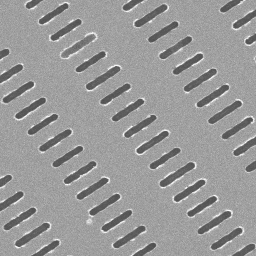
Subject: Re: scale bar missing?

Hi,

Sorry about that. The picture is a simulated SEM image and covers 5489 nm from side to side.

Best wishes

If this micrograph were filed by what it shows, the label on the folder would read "a regular array of holes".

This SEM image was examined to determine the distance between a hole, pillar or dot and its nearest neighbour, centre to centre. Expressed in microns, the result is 0.434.